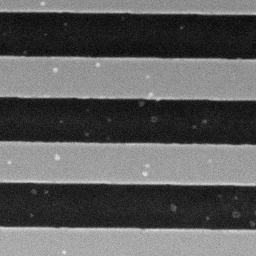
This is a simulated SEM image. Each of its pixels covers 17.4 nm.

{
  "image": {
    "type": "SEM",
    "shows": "lines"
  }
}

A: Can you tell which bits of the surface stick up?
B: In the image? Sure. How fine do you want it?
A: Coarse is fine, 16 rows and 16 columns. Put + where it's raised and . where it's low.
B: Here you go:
++++++++++++++++
................
................
................
++++++++++++++++
++++++++++++++++
................
................
................
++++++++++++++++
++++++++++++++++
...........+++++
................
................
++++++++++++++++
++++++++++++++++